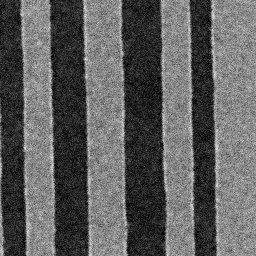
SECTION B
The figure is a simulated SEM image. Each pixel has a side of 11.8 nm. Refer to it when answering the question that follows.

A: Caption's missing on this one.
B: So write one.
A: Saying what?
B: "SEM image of one or a few lines or trenches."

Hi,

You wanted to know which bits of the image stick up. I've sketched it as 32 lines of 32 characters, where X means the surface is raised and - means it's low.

---XXX-----XXXX-----XXXX--XXXXXX
---XXX-----XXXX-----XXXX---XXXXX
---XXX-----XXXX-----XXXX---XXXXX
---XXX-----XXXX-----XXXX---XXXXX
---XXX-----XXXX-----XXXX---XXXXX
---XXX-----XXXX-----XXXX---XXXXX
---XXX-----XXXX-----XXXX---XXXXX
---XXX-----XXXX-----XXXX---XXXXX
---XXX-----XXXX-----XXXX---XXXXX
---XXX-----XXXX-----XXXX---XXXXX
---XXX-----XXXX-----XXXX---XXXXX
---XXX-----XXXX-----XXXX---XXXXX
---XXX-----XXXX-----XXXX---XXXXX
---XXX-----XXXX-----XXXX---XXXXX
---XXX-----XXXX-----XXXX---XXXXX
---XXX-----XXXX-----XXXX---XXXXX
---XXXX----XXXX-----XXXX---XXXXX
---XXX-----XXXX------XXX---XXXXX
---XXXX----XXXX------XXX---XXXXX
---XXXX----XXXX-----XXXX---XXXXX
---XXXX----XXXXX-----XXX---XXXXX
---XXXX----XXXX------XXX---XXXXX
---XXXX----XXXX------XXX---XXXXX
---XXXX----XXXXX-----XXX---XXXXX
---XXXX----XXXXX-----XXX---XXXXX
---XXXX----XXXX------XXX---XXXXX
---XXXX----XXXXX-----XXX---XXXXX
---XXXX----XXXXX-----XXX---XXXXX
---XXXX----XXXXX-----XXX---XXXXX
---XXXX----XXXXX-----XXX---XXXXX
---XXXX----XXXXX-----XXX---XXXXX
---XXXX----XXXXX-----XXX---XXXXX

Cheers